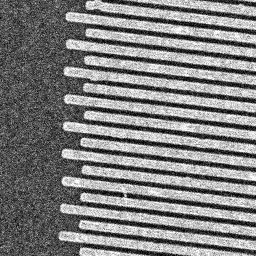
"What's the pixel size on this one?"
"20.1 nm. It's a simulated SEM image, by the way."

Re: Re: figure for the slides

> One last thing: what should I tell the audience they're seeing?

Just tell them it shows parallel lines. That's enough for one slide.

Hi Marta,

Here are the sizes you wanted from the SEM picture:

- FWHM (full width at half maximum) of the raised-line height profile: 152 nanometres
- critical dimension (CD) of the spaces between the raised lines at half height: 120 nanometres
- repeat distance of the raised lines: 275 nanometres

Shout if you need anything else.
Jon